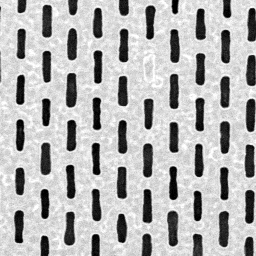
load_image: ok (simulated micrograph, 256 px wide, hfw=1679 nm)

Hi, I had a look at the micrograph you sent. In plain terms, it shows a regular array of holes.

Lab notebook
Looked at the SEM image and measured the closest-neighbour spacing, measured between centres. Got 221 nm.